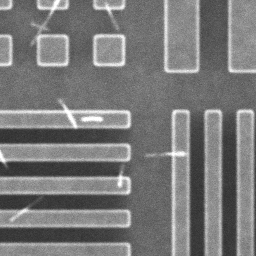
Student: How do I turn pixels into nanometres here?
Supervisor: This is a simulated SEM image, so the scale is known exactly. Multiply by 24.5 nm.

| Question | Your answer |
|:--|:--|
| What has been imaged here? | groups of lines, slits or small figures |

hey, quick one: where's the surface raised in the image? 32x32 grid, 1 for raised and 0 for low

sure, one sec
10000111000011100000011110000111
00000000000000000000011110000111
00000000000000000000011110000111
00000000000000000000011110000111
10000111000011100000011110000111
10000111000011100000011110000111
10000111000011100000011110000111
10000111000011100000011110000111
00000000000000000000011110000111
00000000000000000000000000000000
00000000000000000000000000000000
00000000000000000000000000000000
00000000000000000000000000000000
00000000000000000000000000000000
11111111111111110000001100110011
11111111111111110000001100110011
00000000000000000000001100110011
00000000000000000000001100110011
11111111111111110000001100110011
11111111111111110000001100110011
00000000000000000000001100110011
00000000000000000000001100110011
11111111111111110000001100110011
11111111111111110000001100110011
00000000000000000000001100110011
00000000000000000000001100110011
11111111111111110000001100110011
11111111111111110000001100110011
00000000000000000000001100110011
00000000000000000000001100110011
11111111111111110000001100110011
11111111111111110000001100110011